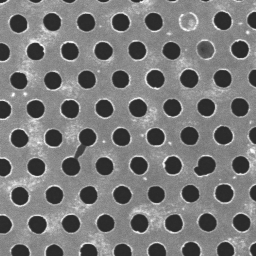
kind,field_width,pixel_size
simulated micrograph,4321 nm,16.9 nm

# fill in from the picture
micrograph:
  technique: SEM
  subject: a regular array of holes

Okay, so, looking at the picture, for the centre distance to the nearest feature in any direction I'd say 557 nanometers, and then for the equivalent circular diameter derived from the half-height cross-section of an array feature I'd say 305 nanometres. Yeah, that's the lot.